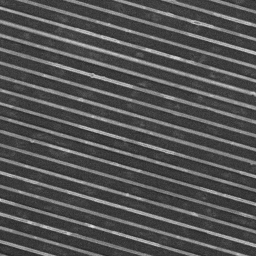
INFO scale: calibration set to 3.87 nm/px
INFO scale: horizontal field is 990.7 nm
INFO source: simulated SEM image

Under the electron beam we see parallel lines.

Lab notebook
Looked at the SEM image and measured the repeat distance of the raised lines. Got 13.2 pixels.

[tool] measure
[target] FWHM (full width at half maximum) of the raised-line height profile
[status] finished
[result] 0.0112 microns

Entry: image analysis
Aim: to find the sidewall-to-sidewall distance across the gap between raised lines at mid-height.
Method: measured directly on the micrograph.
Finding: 10.7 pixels